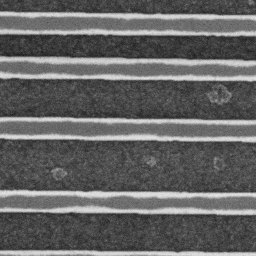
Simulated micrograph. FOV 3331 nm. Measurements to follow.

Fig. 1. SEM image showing lines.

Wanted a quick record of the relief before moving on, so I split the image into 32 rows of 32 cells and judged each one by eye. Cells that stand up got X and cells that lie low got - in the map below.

--------------------------------
--------------------------------
XXXXXXXXXXXXXXXXXXXXXXXXXXXXXXXX
XXXXXXXXXXXXXXXXXXXXXXXXXXXXXXXX
--------------------------------
--------------------------------
--------------------------------
XXXXXXXXXXXXXXX-----------------
XXXXXXXXXXXXXXXXXXXXXXXXXXXXXXXX
XXXXXXXXXXXXXXXXXXXXXXXXXXXXXXXX
--------------------------------
--------------------------------
--------------------------------
--------------------------------
--------------------------------
XXXXXXXXXXXXXXXXXXXXXXXXXXXXXXXX
XXXXXXXXXXXXXXXXXXXXXXXXXXXXXXXX
-----------------------------XXX
--------------------------------
--------------------------------
--------------------------------
--------------------------------
--------------------------------
--------------------------------
XXXXXXXXXXXXXXXXXXXXXXXXXXXXXXXX
XXXXXXXXXXXXXXXXXXXXXXXXXXXXXXXX
--------------XXXXXXXXXXXXXXXXXX
--------------------------------
--------------------------------
--------------------------------
--------------------------------
XX------------------------------